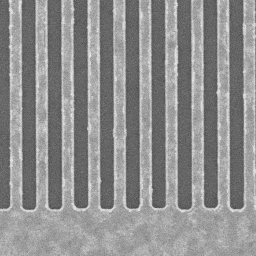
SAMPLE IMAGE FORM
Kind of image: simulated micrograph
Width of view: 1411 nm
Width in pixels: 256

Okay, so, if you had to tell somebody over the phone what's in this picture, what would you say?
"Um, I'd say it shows parallel lines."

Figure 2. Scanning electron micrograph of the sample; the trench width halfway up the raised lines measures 82.6 nm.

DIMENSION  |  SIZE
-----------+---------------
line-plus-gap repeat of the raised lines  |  143 nm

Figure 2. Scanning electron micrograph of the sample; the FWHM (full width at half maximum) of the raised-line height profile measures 0.0592 microns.